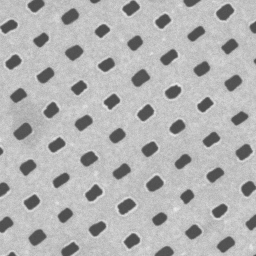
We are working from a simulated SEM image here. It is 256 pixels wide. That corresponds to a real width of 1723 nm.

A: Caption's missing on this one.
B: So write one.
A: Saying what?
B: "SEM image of a regular array of holes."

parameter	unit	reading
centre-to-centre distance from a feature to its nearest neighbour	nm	233